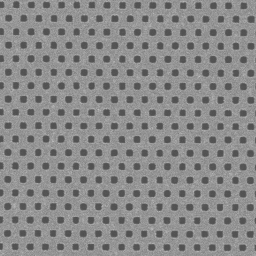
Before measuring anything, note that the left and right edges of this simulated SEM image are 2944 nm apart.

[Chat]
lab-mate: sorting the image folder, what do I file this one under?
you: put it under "a regular array of holes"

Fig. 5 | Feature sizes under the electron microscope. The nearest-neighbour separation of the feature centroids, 14.9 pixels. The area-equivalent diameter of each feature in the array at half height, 87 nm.